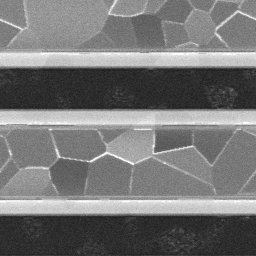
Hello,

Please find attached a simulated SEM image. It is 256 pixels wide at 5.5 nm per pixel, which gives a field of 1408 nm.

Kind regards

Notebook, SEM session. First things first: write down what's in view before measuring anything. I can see one or a few lines or trenches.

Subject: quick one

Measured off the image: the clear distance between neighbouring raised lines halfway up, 333 nanometres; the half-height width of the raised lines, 477 nm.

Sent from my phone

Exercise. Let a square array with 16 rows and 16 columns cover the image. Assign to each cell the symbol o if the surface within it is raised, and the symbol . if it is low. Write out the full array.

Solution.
oooooooooooooooo
oooooooooooooooo
oooooooooooooooo
oooooooooooooooo
................
................
................
oooooooooooooooo
oooooooooooooooo
oooooooooooooooo
oooooooooooooooo
oooooooooooooooo
oooooooooooooooo
................
................
................